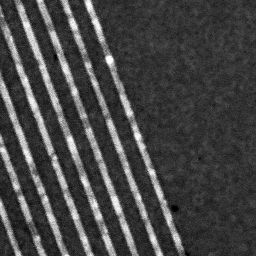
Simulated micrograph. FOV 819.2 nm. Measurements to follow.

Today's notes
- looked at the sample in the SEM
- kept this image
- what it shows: parallel lines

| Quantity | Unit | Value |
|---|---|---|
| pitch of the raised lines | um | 0.0699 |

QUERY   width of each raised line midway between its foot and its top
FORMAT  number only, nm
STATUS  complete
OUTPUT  14.2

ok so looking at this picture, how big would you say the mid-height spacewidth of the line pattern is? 53.9 nanometres